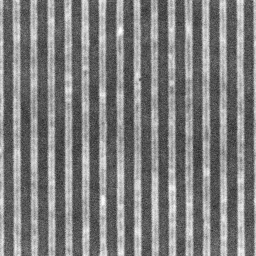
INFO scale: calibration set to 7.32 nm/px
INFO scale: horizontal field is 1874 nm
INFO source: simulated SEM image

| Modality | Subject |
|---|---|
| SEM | parallel lines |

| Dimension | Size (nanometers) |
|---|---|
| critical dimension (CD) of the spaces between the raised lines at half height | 80.5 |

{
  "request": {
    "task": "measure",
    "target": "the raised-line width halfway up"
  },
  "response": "40.2 nm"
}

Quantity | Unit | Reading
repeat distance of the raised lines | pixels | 17.2